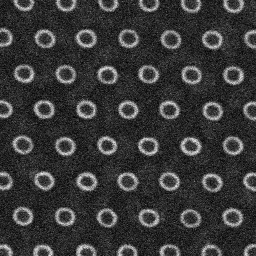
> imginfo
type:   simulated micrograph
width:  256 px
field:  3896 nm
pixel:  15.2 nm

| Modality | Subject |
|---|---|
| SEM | a regular array of raised bodies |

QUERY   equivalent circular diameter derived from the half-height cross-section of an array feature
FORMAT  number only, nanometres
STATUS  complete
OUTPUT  264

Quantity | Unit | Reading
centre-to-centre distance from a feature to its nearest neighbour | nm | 625